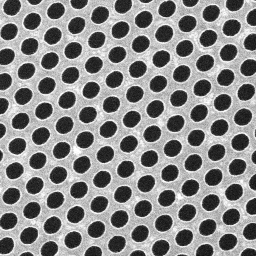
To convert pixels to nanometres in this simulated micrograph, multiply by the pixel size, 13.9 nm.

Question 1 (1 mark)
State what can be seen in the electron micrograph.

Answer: a regular array of holes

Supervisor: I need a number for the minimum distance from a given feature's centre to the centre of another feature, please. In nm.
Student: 347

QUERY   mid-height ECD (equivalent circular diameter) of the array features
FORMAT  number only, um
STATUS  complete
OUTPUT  0.248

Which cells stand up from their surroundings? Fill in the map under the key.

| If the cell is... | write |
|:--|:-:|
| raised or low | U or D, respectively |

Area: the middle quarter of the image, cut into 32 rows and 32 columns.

UUUUUDDDDDUUUUUUDDDDDUUDDUUUDDDU
DDDDUDDDDUUUUUUUDDDDDUUUUUUUDDDD
DDDDUUUUUUUDDDDUDDDDUUUUUUUDDDDD
DDDDUUUUUUDDDDDUUDDUUUDDDUUDDDDU
DDDUUUDDUUDDDDDUUUUUUDDDDDUUDDUU
UUUUUDDDDUUDDDUUUDDUUDDDDDUUUUUU
UUUUUDDDDUUUUUUUDDDDUUDDDUUUDUUU
DDDUUDDDDUUUUUUDDDDDUUUUUUUDDDDU
DDDUUDDUUUUDDDUDDDDUUUUUUUDDDDDU
DDDUUUUUUUDDDDUUDDUUUUDDDUUDDDDU
DDUUUUUUUUDDDDUUUUUUUDDDDUUDDUUU
UUUUDDDDUUDDDUUUUUUUDDDDDUUUUUUU
UUUUDDDDUUUUUUUDDDDUUDDDUUUUUUUD
DDUUDDDDUUUUUUUDDDDUUUDUUUDDDDUU
DDUUDDDUUUDDDUUDDDDUUUUUUUDDDDUU
DDUUUUUUUDDDDUUDDDUUUDDUUUDDDDUU
DDUUUUUUUDDDDUUUUUUUDDDDUUDDDUUU
UUUUDDDUUDDDDUUUUUUUDDDDUUUUUUUD
UUUDDDDDUUDUUUUDDDUUDDDDUUUUUUUD
DUUDDDDUUUUUUUDDDDDUUDDUUUDDDUUD
DDUDDDDUUUDDUUDDDDUUUUUUUDDDDDUU
DDUUUUUUUDDDUUDDDDUUUDUUUDDDDUUU
DUUUUUUUDDDDDUUUUUUUDDDUUDDDDUUU
UUUUDDUUDDDDUUUUUUUDDDDDUUUUUUUD
UUDDDDDUUDDUUUUDDUUDDDDUUUUUUUDD
UUDDDDDUUUUUUDDDDDUUDDUUUUDDUUDD
UUDDDDUUUUUUUDDDDDUUUUUUUDDDDUUD
DUUUDUUUDDDUUDDDDUUUUUUUDDDDDUUU
DUUUUUUDDDDDUUUDUUUDDDDUDDDDUUUU
UUUDDUUDDDDDUUUUUUDDDDDUUUUUUUDD
UUDDDDUUDDDUUUUDUUDDDDDUUUUUUDDD
UDDDDDUUUUUUUDDDDUUDDDUUUDDUUDDD